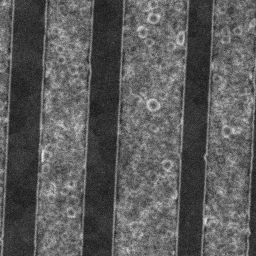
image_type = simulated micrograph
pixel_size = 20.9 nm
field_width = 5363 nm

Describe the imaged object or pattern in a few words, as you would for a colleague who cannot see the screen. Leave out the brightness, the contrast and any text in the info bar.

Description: one or a few lines or trenches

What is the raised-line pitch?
1790 nm